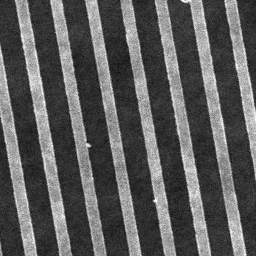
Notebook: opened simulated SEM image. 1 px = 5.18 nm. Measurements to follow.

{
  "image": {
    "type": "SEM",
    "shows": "parallel lines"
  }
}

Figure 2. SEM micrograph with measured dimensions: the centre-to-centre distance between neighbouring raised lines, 178 nanometres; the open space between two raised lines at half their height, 122 nanometres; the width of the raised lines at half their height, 58.7 nm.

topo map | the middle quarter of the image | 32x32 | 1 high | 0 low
11000000111000000111000000110000
11000000111000000111000000110000
11000000011000000111000000111000
11100000011100000011000000111000
11100000011100000011000000111000
11100000011100000011000000011000
01100000011100000011100000011000
01100000011100000011100000011100
01110000001100000011100000011100
01110000001110000001100000011100
01110000001110000001100000011100
00110000001110000001110000001100
00110000001110000001110000001100
00110000000110000001110000001110
00111000000110000000110000001110
00111000000111000000110000001110
00111000000111000000110000000110
00011000000111000000111000000110
00011000000111000000111000000110
00011000000011000000111000000111
00011100000011000000011000000111
00011100000011100000011000000111
00011100000011100000011000000011
00001100000011100000011100000011
00001100000011100000011100000011
00001110000001100000011100000011
00001110000001110000001100000011
00001110000001110000001100000011
00001110000001110000001110000001
00000110000001110000001110000001
00000110000001110000001110000001
00000111000000110000001110000001